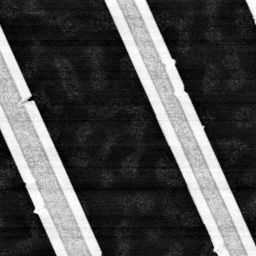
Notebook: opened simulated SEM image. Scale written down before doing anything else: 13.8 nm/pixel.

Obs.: one or a few lines or trenches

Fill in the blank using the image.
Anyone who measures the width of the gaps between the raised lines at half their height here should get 1590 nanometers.